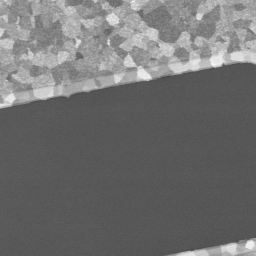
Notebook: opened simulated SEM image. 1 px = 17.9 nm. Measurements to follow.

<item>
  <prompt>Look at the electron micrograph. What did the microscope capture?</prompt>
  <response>one or a few lines or trenches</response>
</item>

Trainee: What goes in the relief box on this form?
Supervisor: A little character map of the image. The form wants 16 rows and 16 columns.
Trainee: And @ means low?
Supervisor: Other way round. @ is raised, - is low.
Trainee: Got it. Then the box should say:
@@@@@@@@@@@@@@@@
@@@@@@@@@@@@@@@@
@@@@@@@@@@@@@@@@
@@@@@@@@@@@@@@@@
@@@@@@@@@@------
@@@@@-----------
----------------
----------------
----------------
----------------
----------------
----------------
----------------
----------------
----------------
---------------@